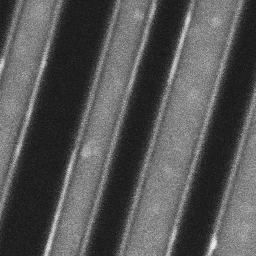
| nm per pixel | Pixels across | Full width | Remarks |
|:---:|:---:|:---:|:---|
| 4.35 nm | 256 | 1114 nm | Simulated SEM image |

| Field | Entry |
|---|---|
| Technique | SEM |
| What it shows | one or a few lines or trenches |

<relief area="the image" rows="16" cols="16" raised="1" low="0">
1000111001110001
1001111001110001
1001111001100011
0001111001100011
0011110011100011
0011110011100111
0011110011000111
0011100111000111
0111100111000110
0111100110001110
0111100110001110
1111001110001100
1111001110011100
1111001100011100
1110011100011100
1110011100111000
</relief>